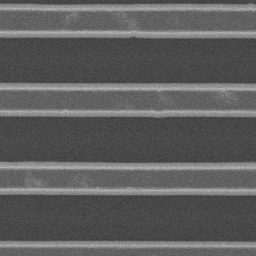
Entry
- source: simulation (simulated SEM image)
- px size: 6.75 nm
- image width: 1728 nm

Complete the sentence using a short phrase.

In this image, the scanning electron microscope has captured one or a few lines or trenches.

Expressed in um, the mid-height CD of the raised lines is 0.184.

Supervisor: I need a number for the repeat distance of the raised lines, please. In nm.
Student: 533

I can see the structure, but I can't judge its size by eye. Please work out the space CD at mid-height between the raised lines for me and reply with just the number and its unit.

0.345 um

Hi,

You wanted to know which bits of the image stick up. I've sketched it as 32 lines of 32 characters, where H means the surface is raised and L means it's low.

LLLLLLLLLLLLLLLLLLLLLLLLLLLLLLLL
HHHHHHHHHHHHHHHHHHHHHHHHHHHHHHHH
HHHHHHHHHHHHHHHHHHHHHHHHHHHHHHHH
HHHHHHHHHHHHHHHHHHHHHHHHHHHHHHHH
LLLLLLLLLLLLLLLLLLLLLLLLLLLLLLLL
LLLLLLLLLLLLLLLLLLLLLLLLLLLLLLLL
LLLLLLLLLLLLLLLLLLLLLLLLLLLLLLLL
LLLLLLLLLLLLLLLLLLLLLLLLLLLLLLLL
LLLLLLLLLLLLLLLLLLLLLLLLLLLLLLLL
LLLLLLLLLLLLLLLLLLLLLLLLLLLLLLLL
LLLLLLLLLLLLLLLLLLLLLLLLLLLLLLLL
HHHHHHHHHHHHHHHHHHHHHHHHHHHHHHHH
HHHHHHHHHHHHHHHHHHHHHHHHHHHHHHHH
HHHHHHHHHHHHHHHHHHHHHHHHHHHHHHHH
LLLLLLLLLLLLLLLLLLLLLLLLLLLLLLLL
LLLLLLLLLLLLLLLLLLLLLLLLLLLLLLLL
LLLLLLLLLLLLLLLLLLLLLLLLLLLLLLLL
LLLLLLLLLLLLLLLLLLLLLLLLLLLLLLLL
LLLLLLLLLLLLLLLLLLLLLLLLLLLLLLLL
LLLLLLLLLLLLLLLLLLLLLLLLLLLLLLLL
LLLLLLLLLLLLLLLLLLLLLLLLLLLLLLLL
HHHHHHHHHHHHHHHHHHHHHHHHHHHHHHHH
HHHHHHHHHHHHHHHHHHHHHHHHHHHHHHHH
HHHHHHHHHHHHHHHHHHHHHHHHHHHHHHHH
LLLLLLLLLLLLLLLLLLLLLLLLLLLLLLLL
LLLLLLLLLLLLLLLLLLLLLLLLLLLLLLLL
LLLLLLLLLLLLLLLLLLLLLLLLLLLLLLLL
LLLLLLLLLLLLLLLLLLLLLLLLLLLLLLLL
LLLLLLLLLLLLLLLLLLLLLLLLLLLLLLLL
LLLLLLLLLLLLLLLLLLLLLLLLLLLLLLLL
LLLLLLLLHHHHHHHHLLLLLLLLLLLLLLLL
HHHHHHHHHHHHHHHHHHHHHHHHHHHHHHHH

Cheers